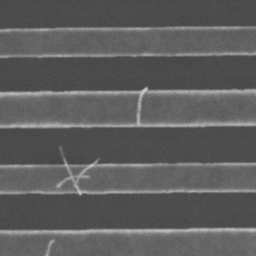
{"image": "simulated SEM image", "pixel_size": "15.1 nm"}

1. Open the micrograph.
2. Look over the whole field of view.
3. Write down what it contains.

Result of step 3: lines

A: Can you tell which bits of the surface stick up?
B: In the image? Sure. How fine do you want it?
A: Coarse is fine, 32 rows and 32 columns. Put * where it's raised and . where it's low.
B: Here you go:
................................
................................
................................
......................**.*******
********************************
********************************
********************************
................................
................................
................................
................................
.....*...***********************
********************************
********************************
********************************
********************************
................................
................................
................................
................................
...........................*****
********************************
********************************
********************************
................................
................................
................................
................................
................................
********************************
********************************
********************************